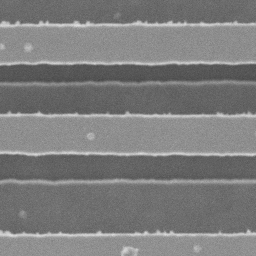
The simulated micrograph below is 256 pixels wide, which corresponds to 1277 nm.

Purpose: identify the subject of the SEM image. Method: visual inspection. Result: lines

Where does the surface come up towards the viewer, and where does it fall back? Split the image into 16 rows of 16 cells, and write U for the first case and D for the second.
DDDDDDDDDDDDDDDD
DDDDDDDDUDDDDDUU
UUUUUUUUUUUUUUUU
UUUUUUUUUUUUUUUU
DDDDDDDDDDDDDDDD
DDDDDDDDDDDDDDDD
DDDDDDDDDDDDDDDD
UUUUUUUUUUUUUUUU
UUUUUUUUUUUUUUUU
UUUUUUUUUUUUUUUU
DDDDDDDDDDDDDDDD
DDDDDDDDDDDDDDDD
DDDDDDDDDDDDDDDD
DDDDDDDDDDDDDDDD
DDDDDDDDDDDDDDDD
UUUUUUUUUUUUUUUU